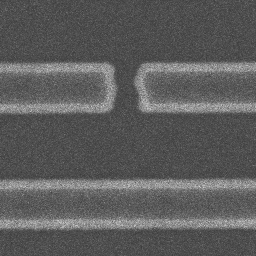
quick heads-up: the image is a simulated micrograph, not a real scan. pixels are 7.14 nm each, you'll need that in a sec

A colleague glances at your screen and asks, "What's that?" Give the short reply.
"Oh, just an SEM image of one or a few lines or trenches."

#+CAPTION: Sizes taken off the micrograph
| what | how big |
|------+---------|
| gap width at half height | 0.542 µm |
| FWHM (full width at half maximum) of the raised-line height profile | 286 nm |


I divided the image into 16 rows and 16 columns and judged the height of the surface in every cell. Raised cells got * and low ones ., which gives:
................
................
................
................
*******..*******
*******..*******
*******..*******
................
................
................
................
...............*
****************
****************
................
................